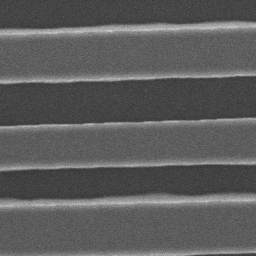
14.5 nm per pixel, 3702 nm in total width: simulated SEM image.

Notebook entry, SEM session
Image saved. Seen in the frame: lines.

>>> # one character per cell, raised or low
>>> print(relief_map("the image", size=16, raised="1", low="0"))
0000000000000000
0000000000000000
1111111111111111
1111111111111111
1111111111111111
0000000000000000
0000000000000000
0000000000000011
1111111111111111
1111111111111111
1100000000000000
0000000000000000
0000000000000111
1111111111111111
1111111111111111
1111111111111111